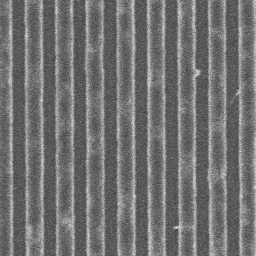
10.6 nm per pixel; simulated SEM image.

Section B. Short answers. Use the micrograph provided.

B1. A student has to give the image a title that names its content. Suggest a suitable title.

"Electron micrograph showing parallel lines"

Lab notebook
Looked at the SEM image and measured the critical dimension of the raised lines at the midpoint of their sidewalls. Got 170 nm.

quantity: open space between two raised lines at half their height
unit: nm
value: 151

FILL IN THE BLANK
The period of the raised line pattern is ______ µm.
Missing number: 0.324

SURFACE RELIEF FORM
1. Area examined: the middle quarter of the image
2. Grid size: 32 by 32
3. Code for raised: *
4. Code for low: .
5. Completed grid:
**...****....****....****....***
**...*****...****....****....***
**....****....***....****....***
**....****....***....****....***
**....****....***....****....***
**....****....***....****....***
**....****....***....****....***
**....****....***....****....***
**....****....***....****....***
**....****....***....****....***
**....****....***....****....***
**....****....***....****....***
**....****....***....****....***
**....****....***....****....***
**....****....***....****....***
**....****....***....****....***
**....****....***....****....***
**....****...****....****....***
**....****...****....****....***
**....****....****...****....***
**....****....****...****....***
**....****....***....****....***
**....****....***....****....***
**....****....****...****....***
**....****....***....****....***
**....****....***....****....***
**....****....***....****....***
**....****....****...****....***
**....****....***....****....***
**....****....****...****....***
**....****....***....****....***
**....****....***....****....***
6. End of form